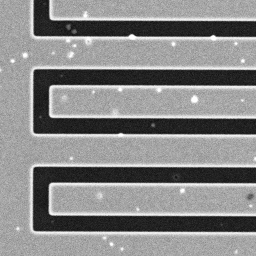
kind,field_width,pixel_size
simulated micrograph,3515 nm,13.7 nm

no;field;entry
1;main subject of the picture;groups of lines, slits or small figures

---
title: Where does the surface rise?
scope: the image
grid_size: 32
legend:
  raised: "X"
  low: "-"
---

XXXX--XXXXXXXXXXXXXXXXXXXXXXXXXX
XXXX--XXXXXXXXXXXXXXXXXXXXXXXXXX
XXXX------XXXXXXXXXXXXXXXXXXXXXX
XXXX----------------------------
XXXXX-----------X---------------
XXXXXXXXXXXXXXXXXXXXXXXXXXXXXXXX
XXXXXXXXXXXXXXXXXXXXXXXXXXXXXXXX
XXXXXXXXXXXXXXXXXXXXXXXXXXXXXXXX
XXXXXXXXXXXXXXXXXXXXXXXXXXXXXXXX
XXXX----------------------------
XXXX----------------------------
XXXX--XXXXXXXXXXXXXXXXXXXXXXXXXX
XXXX--XXXXXXXXXXXXXXXXXXXXXXXXXX
XXXX--XXXXXXXXXXXXXXXXXXXXXXXXXX
XXXX--XXXXXXXXXXXXXXXXXXXXXXXXXX
XXXX----------------------------
XXXX----------------------------
XXXXXXXXXXXXXXXXXXXXXXXXXXXXXXXX
XXXXXXXXXXXXXXXXXXXXXXXXXXXXXXXX
XXXXXXXXXXXXXXXXXXXXXXXXXXXXXXXX
XXXXXXXXXXXXXXXXXXXXXXXXXXXXXXXX
XXXX----------------------------
XXXX----------------------------
XXXX--XXXXXXXXXXXXXXXXXXXXXXXXXX
XXXX--XXXXXXXXXXXXXXXXXXXXXXXXXX
XXXX--XXXXXXXXXXXXXXXXXXXXXXXXXX
XXXX--XXXXXXXXXXXXXXXXXXXXXXXXXX
XXXX----------------------------
XXXX----------------------------
XXXXXXXXXXXXXXXXXXXXXXXXXXXXXXXX
XXXXXXXXXXXXXXXXXXXXXXXXXXXXXXXX
XXXXXXXXXXXXXXXXXXXXXXXXXXXXXXXX